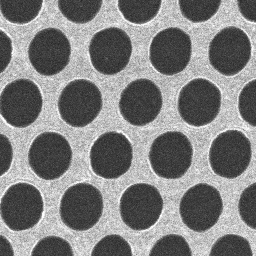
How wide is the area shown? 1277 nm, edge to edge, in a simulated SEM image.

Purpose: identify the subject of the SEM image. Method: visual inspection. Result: a regular array of holes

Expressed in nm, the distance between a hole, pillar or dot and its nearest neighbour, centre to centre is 296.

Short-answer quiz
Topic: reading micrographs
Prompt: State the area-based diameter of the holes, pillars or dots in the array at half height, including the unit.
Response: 44.6 pixels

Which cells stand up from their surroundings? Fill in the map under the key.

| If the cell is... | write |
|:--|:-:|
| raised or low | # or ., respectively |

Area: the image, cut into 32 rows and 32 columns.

.....##......##.....##.....###..
.....###....###.....###....###..
#...#####..#####...#####..#####.
##############.######.######..##
.###....####....###.....###....#
.###.....##.....###.....##.....#
.###.....##.....###.....##.....#
.###.....##.....###.....##.....#
.###....####....###....####...##
################################
#...#####...####...####....####.
.....###....###.....###....###..
.....##......##.....##......##..
.....##......##.....##.....###..
.....###....###.....###....###..
#...#####..######.######..#####.
#####################.######..##
.###....####....###.....###....#
..##.....##.....###.....##.....#
..##.....##......##.....##.....#
.###.....##.....###.....##.....#
.###....####....###....####...##
################################
#...#####...####...#####...####.
.....###.....##.....###.....##..
.....###.....##.....###.....##..
.....###.....##.....###.....##..
.....###....###.....###....###..
#...#####..#####..######..######
#############..######.######..##
.####....###....###....####....#
..##.....###....###.....##.....#